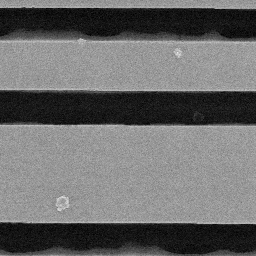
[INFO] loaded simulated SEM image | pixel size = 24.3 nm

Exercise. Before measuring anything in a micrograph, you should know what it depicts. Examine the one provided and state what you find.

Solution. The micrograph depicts lines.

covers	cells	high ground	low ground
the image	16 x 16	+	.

.............+++
................
++++++.++++.++..
++++++++++++++++
++++++++++++++++
++++++++++++++++
................
................
++++++++++++++++
++++++++++++++++
++++++++++++++++
++++++++++++++++
++++++++++++++++
++++++++++++++++
................
................